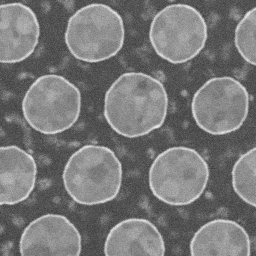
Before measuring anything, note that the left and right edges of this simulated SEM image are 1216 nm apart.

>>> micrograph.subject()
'raised bodies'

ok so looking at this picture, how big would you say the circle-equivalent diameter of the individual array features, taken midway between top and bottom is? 272 nm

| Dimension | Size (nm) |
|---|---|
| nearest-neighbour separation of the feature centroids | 390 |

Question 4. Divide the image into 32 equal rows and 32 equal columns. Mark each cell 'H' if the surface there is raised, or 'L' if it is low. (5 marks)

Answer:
LLLLLLLLLLLLLLLLLLLLLLLLLLLLLLLL
HHHHLLLLLLHHHHLLLLLLHHHHHLLLLLLH
HHHHHLLLLHHHHHHLLLLHHHHHHLLLLLHH
HHHHHLLLHHHHHHHLLLLHHHHHHHLLLLHH
HHHHHLLLHHHHHHHLLLLHHHHHHHLLLLHH
HHHHHLLLHHHHHHHLLLLHHHHHHLLLLLHH
HHHHLLLLLHHHHHHLLLLLHHHHHLLLLLHH
HHHLLLLLLLLHHLLLLLLLLHHLLLLLLLLH
LLLLLLLLLLLLLLLLLLLLLLLLLLLLLLLL
LLLLLLHLLLLLLLLHHHLLLLLLLLLLLLLL
LLLLHHHHHLLLLLHHHHHHLLLLLLHHHHLL
LLLLHHHHHHLLLHHHHHHHHLLLLHHHHHHL
LLLHHHHHHHLLLHHHHHHHHLLLHHHHHHHL
LLLHHHHHHHLLLHHHHHHHHLLLHHHHHHHL
LLLHHHHHHHLLLHHHHHHHHLLLHHHHHHHL
LLLLHHHHHLLLLLHHHHHHLLLLLHHHHHLL
LLLLLHHLLLLLLLLHHHLLLLLLLLHHLLLL
LLLLLLLLLLLLLLLLLLLLLLLLLLLLLLLL
HHLLLLLLLLHHHLLLLLLLLLHLLLLLLLLL
HHHHLLLLLHHHHHLLLLLLHHHHHLLLLLHH
HHHHLLLLLHHHHHHLLLLHHHHHHHLLLLHH
HHHHLLLLHHHHHHHLLLLHHHHHHHLLLHHH
HHHHLLLLHHHHHHHLLLLHHHHHHHLLLHHH
HHHHLLLLHHHHHHHLLLLHHHHHHHLLLHHH
HHHLLLLLLHHHHHLLLLLLHHHHHLLLLLHH
LLLLLLLLLLLLLLLLLLLLLLHLLLLLLLLH
LLLLLLLLLLLLLLLLLLLLLLLLLLLLLLLL
LLLLLHHHLLLLLLLLHHLLLLLLLLLLLLLL
LLLHHHHHHLLLLLHHHHHLLLLLLHHHHHLL
LLLHHHHHHHLLLLHHHHHHLLLLHHHHHHHL
LLLHHHHHHHLLLHHHHHHHLLLLHHHHHHHL
LLLHHHHHHHLLLHHHHHHHLLLLHHHHHHHL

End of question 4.